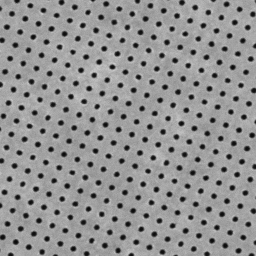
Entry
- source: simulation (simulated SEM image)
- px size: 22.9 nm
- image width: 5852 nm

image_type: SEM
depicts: a regular array of holes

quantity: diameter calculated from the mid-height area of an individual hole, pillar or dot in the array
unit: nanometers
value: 134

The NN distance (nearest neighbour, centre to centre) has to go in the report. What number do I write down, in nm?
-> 318